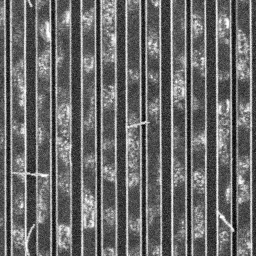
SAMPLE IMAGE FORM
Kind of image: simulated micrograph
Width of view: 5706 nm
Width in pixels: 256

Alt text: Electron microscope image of parallel lines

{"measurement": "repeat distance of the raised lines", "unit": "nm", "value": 503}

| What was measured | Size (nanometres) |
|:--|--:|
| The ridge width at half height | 326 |